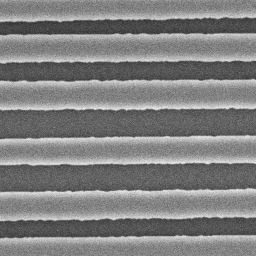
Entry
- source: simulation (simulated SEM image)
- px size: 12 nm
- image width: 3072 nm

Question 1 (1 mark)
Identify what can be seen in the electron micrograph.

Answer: lines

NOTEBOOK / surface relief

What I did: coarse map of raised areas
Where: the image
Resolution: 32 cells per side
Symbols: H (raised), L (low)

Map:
HHHHHHHHHHHHHHHHHHHHHHHHHHHHHHHH
HHHHHHHHHHHHHHHHHHHHHHHHHHHHHHHH
HHHHHHHHHHLLLLLLLLLLLLLLLLLLLLLL
LLLLLLLLLLLLLLLLLLLLLLLLLLLLLLLL
HHHHHHHHHHHHHHHHHHHHHHHHHHHHHHHH
HHHHHHHHHHHHHHHHHHHHHHHHHHHHHHHH
HHHHHHHHHHHHHHHHHHHHHHHHHHHHHHHH
HHHHHHHHHHHHHHHHHHHHHHHHHHHHHHHH
LLLLLLLLLLLLLLLLLLLLLLLLLLLLLLLL
LLLLLLLLLLLLLLLLLLLLLLLLLLLLLLLL
HHHHHHHHHHHHHHHHHHHHHHHHHHHHHHHH
HHHHHHHHHHHHHHHHHHHHHHHHHHHHHHHH
HHHHHHHHHHHHHHHHHHHHHHHHHHHHHHHH
HHHHHHHHHHHHHHHHHHHHHHHHHHHHHHHH
LLLLLLLLLLLLLLLLLLLLLLLLLLLLLLLL
LLLLLLLLLLLLLLLLLLLLLLLLLLLLLLLL
LLLLLLLLLLLLLLLLLLLLLLLLLLLLLLLL
HHHHHHHHHHHHHHHHHHHHHHHHHHHHHHHH
HHHHHHHHHHHHHHHHHHHHHHHHHHHHHHHH
HHHHHHHHHHHHHHHHHHHHHHHHHHHHHHHH
HHHHHHHHHHHHLLLHLLLLLLLLLLLLLLLL
LLLLLLLLLLLLLLLLLLLLLLLLLLLLLLLL
LLLLLLLLLLLLLLLLLLLLLLLLLLLLLLLL
LLLLLLLLLLLLLLLLLLLLLLLLLLLLLLLL
HHHHHHHHHHHHHHHHHHHHHHHHHHHHHHHH
HHHHHHHHHHHHHHHHHHHHHHHHHHHHHHHH
HHHHHHHHHHHHHHHHHHHHHHHHHHHHHHHH
HHLHLLHLLLHLLLLLLLLLLLLLLLLLLLLL
LLLLLLLLLLLLLLLLLLLLLLLLLLLLLLLL
LLLLLLLLLLLLLLLLLLLLLLHHLHHHHHHH
HHHHHHHHHHHHHHHHHHHHHHHHHHHHHHHH
HHHHHHHHHHHHHHHHHHHHHHHHHHHHHHHH